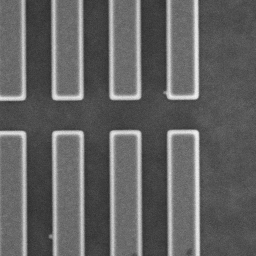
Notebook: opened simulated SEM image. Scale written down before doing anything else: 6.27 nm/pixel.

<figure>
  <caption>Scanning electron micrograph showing groups of lines, slits or small figures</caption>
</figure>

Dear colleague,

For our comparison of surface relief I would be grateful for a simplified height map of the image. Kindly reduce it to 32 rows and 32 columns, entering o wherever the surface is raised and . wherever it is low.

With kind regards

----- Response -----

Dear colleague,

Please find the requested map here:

ooo....ooo....ooo....ooo........
ooo....ooo....ooo....ooo........
ooo....ooo....ooo....ooo........
ooo....ooo....ooo....oooo.......
ooo....ooo....ooo....oooo.......
ooo....ooo....ooo....oooo.......
ooo....ooo....ooo....oooo.......
ooo....ooo....ooo....oooo.......
ooo....ooo....ooo....oooo.......
ooo....ooo....ooo....oooo.......
ooo....ooo....ooo....oooo.......
ooo....ooo....ooo....oooo.......
................................
................................
................................
................................
...............oo....ooo........
ooo....ooo....ooo....oooo.......
ooo....ooo....ooo....oooo.......
ooo....ooo....ooo....oooo.......
ooo....ooo....ooo....oooo.......
ooo....ooo....ooo....oooo.......
ooo....ooo....ooo....oooo.......
ooo....ooo....ooo....oooo.......
ooo....ooo....ooo....oooo.......
ooo....ooo....ooo....oooo.......
ooo....ooo....ooo....oooo.......
ooo....ooo....ooo....oooo.......
ooo....ooo....ooo....oooo.......
ooo....ooo....oooo...oooo.......
ooo....ooo....oooo...oooo.......
ooo....ooo....oooo...oooo.......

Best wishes